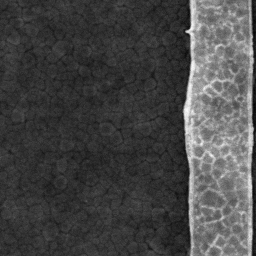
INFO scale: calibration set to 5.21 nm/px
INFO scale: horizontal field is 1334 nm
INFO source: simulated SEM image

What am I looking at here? one or a few lines or trenches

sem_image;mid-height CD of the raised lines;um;0.322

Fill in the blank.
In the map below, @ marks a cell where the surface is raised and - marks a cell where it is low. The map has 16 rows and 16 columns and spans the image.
------------@@@@
------------@@@@
------------@@@@
------------@@@@
------------@@@@
------------@@@@
------------@@@@
------------@@@@
------------@@@@
------------@@@@
------------@@@@
------------@@@@
------------@@@@
------------@@@@
------------@@@@
------------@@@@